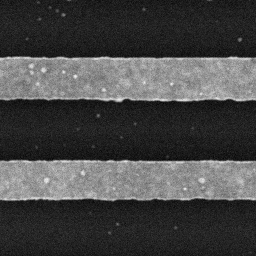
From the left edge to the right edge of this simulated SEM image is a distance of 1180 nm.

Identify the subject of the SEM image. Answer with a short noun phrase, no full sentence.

lines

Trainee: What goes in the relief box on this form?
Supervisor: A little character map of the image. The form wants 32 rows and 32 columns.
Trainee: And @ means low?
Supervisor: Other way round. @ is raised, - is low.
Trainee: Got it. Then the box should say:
--------------------------------
--------------------------------
--------------------------------
--------------------------------
--------------------------------
--------------------------------
--------------------------------
@@@@@@@@@@@@@@@@@@@@@@@@@@@@@@@@
@@@@@@@@@@@@@@@@@@@@@@@@@@@@@@@@
@@@@@@@@@@@@@@@@@@@@@@@@@@@@@@@@
@@@@@@@@@@@@@@@@@@@@@@@@@@@@@@@@
@@@@@@@@@@@@@@@@@@@@@@@@@@@@@@@@
------------------@@@@@@@----@@-
--------------------------------
--------------------------------
--------------------------------
--------------------------------
--------------------------------
--------------------------------
--------------------------------
@@@@@@@@@@@@@@@@@@@@@@@@@@@@@@@@
@@@@@@@@@@@@@@@@@@@@@@@@@@@@@@@@
@@@@@@@@@@@@@@@@@@@@@@@@@@@@@@@@
@@@@@@@@@@@@@@@@@@@@@@@@@@@@@@@@
@@@@@@@@@@@@@@@@@@@@@@@@@@@@@@@@
--------------------------------
--------------------------------
--------------------------------
--------------------------------
--------------------------------
--------------------------------
--------------------------------